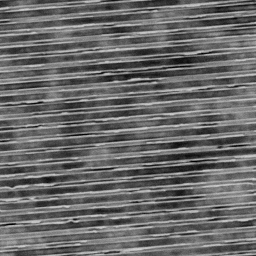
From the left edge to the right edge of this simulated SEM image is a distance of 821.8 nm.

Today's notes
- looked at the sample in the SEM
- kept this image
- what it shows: parallel lines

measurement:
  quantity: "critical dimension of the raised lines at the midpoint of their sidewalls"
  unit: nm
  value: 16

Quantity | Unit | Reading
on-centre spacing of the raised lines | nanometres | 38.3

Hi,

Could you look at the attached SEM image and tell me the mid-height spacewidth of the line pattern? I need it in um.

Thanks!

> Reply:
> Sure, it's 0.0224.